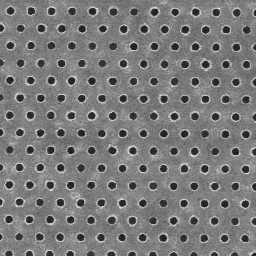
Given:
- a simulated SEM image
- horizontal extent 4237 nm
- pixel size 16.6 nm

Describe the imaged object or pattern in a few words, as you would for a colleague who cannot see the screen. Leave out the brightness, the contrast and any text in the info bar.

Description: a regular array of holes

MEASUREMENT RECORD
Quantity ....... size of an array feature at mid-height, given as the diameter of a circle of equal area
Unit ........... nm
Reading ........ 128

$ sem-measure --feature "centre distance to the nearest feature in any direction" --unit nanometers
331